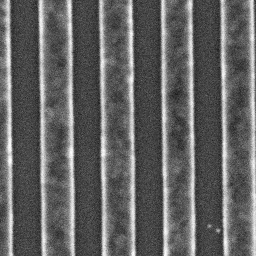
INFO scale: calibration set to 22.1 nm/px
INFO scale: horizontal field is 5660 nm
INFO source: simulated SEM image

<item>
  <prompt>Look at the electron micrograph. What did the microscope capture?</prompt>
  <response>wiring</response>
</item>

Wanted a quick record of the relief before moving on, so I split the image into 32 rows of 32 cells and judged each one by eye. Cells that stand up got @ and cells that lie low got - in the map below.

@----@@@@----@@@----@@@@----@@@@
@----@@@@----@@@----@@@@----@@@@
@----@@@@----@@@----@@@@----@@@@
@----@@@@----@@@----@@@@----@@@@
@----@@@@----@@@----@@@@----@@@@
@----@@@@----@@@----@@@@----@@@@
@----@@@@----@@@----@@@@----@@@@
@----@@@@----@@@----@@@@----@@@@
@----@@@@----@@@----@@@@----@@@@
@----@@@@----@@@----@@@@----@@@@
@----@@@@----@@@----@@@@----@@@@
@----@@@@----@@@----@@@@----@@@@
@----@@@@----@@@----@@@@----@@@@
@----@@@@----@@@----@@@@----@@@@
@----@@@@----@@@@---@@@@----@@@@
@----@@@@----@@@@---@@@@----@@@@
@----@@@@----@@@@---@@@@----@@@@
@----@@@@----@@@@---@@@@----@@@@
@----@@@@----@@@@---@@@@----@@@@
@----@@@@----@@@@---@@@@----@@@@
@----@@@@----@@@@---@@@@----@@@@
@----@@@@----@@@@----@@@----@@@@
@----@@@@----@@@@----@@@----@@@@
@----@@@@----@@@@----@@@----@@@@
@----@@@@----@@@@----@@@----@@@@
@----@@@@----@@@@----@@@----@@@@
@----@@@@----@@@@----@@@----@@@@
@----@@@@----@@@@----@@@----@@@@
@----@@@@----@@@@----@@@----@@@@
@----@@@@----@@@@----@@@----@@@@
@----@@@@----@@@@----@@@----@@@@
@----@@@@----@@@@----@@@----@@@@